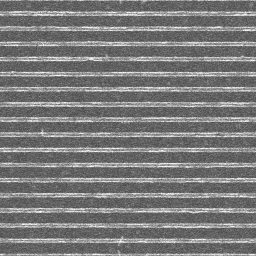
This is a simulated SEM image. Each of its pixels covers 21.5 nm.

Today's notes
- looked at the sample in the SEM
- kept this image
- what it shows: parallel lines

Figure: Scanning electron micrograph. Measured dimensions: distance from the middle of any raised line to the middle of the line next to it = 326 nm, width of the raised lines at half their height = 4.25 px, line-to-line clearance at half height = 237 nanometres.